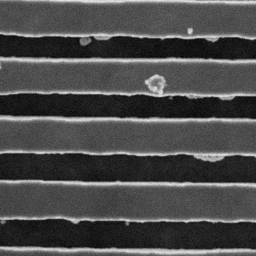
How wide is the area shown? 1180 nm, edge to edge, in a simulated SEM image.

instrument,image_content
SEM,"lines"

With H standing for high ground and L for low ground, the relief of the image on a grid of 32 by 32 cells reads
HHHHHHHHHHHHHHHHHHHHHHHHHHHHHHHH
HHHHHHHHHHHHHHHHHHHHHHHHHHHHHHHH
HHHHHHHHHHHHHHHHHHHHHHHHHHHHHHHH
HHHHHHHHHHHHHHHHHHHHHHHHHHHHHHHH
LLLHHHLLHHHLLHLLHHHHHHHHHHHHHHHH
LLLLLLLLLLLLLLLLLLLLLLLLLLLLLLLL
LLLLLLLLLLLLLLLLLLLLLLLLLLLLLLLL
HHHHHHHHHHHHHHHHHHHHHHHHHHHHLLLL
HHHHHHHHHHHHHHHHHHHHHHHHHHHHHHHH
HHHHHHHHHHHHHHHHHHHHHHHHHHHHHHHH
HHHHHHHHHHHHHHHHHHHHHHHHHHHHHHHH
HHHHHHHHHHHHHHHHHHHHHHHHHHHHHHHH
LLLLLLLLLLLLLLLLLLLLLLLLLLLLLLLL
LLLLLLLLLLLLLLLLLLLLLLLLLLLLLLLL
LLLLLLLLLLLLLLLLLLLLLLLLLLLLLLLL
HHHHHHHHHHHHHHHHHHHHHHHHHHHHHHHH
HHHHHHHHHHHHHHHHHHHHHHHHHHHHHHHH
HHHHHHHHHHHHHHHHHHHHHHHHHHHHHHHH
HHHHHHHHHHHHHHHHHHHHHHHHHHHHHHHH
LLLLLLLLLLLLLLLLLLLLLLLLLLLLLLLL
LLLLLLLLLLLLLLLLLLLLLLLLLLLLLLLL
LLLLLLLLLLLLLLLLLLLLLLLLLLLLLLLL
LLLLLLLLLLLLLLLLLLLLLLLLLLLLLLLL
HHHHHHHHHHHHHHHHHHHHHHHHHHHHHHHH
HHHHHHHHHHHHHHHHHHHHHHHHHHHHHHHH
HHHHHHHHHHHHHHHHHHHHHHHHHHHHHHHH
HHHHHHHHHHHHHHHHHHHHHHHHHHHHHHHH
LLLLLLLLHHHHHHHHHHHHHHHHHHHHHHHH
LLLLLLLLLLLLLLLLLLLLLLLLLLLLLLLL
LLLLLLLLLLLLLLLLLLLLLLLLLLLLLLLL
LLLLLLLLLLLLLLLLLLLLLLLLLLLLLLLL
HHHHHHHHHHHHHHHHHHHHHHHHHHHHHHHH